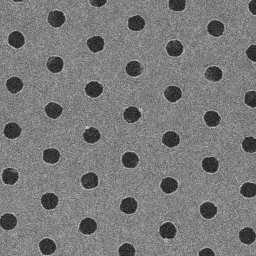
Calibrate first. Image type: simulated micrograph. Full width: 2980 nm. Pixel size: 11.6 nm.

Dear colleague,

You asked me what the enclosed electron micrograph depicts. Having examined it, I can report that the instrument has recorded a regular array of holes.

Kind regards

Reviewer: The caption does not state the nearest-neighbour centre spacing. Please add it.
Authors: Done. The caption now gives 527 nanometers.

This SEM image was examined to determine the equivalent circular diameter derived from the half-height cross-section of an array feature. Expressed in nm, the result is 209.